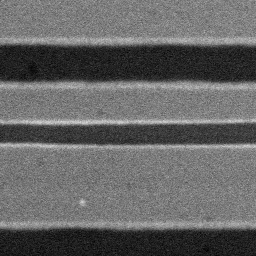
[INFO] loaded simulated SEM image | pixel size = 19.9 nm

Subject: lines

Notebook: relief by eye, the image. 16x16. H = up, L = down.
HHHHHHHHHHHHHHHH
HHHHHHHHHHHHHHHH
LLLLLLLLLLLLLLLL
LLLLLLLLLLLLLLLL
LLLLLLLLLLLLLLLL
HHHHHHHHHHHHHHHH
HHHHHHHHHHHHHHHH
HHHHHHHHHHHHHHHH
HHHHHHHHHHHHHHHH
HHHHHHHHHHHHHHHH
HHHHHHHHHHHHHHHH
HHHHHHHHHHHHHHHH
HHHHHHHHHHHHHHHH
HHHHHHHHHHHHHHHH
LLLLLLLLLLLLLLLL
LLLLLLLLLLLLLLLL